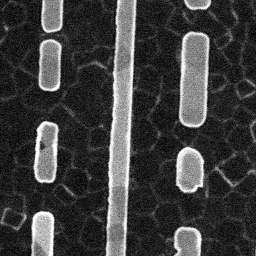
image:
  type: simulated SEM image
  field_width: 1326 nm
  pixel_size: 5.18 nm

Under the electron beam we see one or a few lines or trenches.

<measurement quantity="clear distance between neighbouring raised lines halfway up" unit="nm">278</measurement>